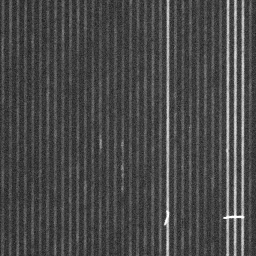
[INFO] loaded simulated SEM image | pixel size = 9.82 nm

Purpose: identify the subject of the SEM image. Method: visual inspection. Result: parallel lines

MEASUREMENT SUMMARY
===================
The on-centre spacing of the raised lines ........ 73.6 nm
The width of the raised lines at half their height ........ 1.5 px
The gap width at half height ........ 58.9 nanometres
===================